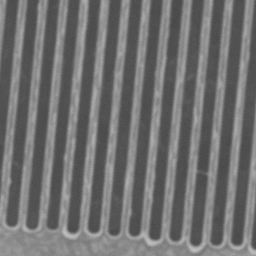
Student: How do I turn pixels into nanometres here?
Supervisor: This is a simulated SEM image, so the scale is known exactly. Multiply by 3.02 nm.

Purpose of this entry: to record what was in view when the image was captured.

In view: parallel lines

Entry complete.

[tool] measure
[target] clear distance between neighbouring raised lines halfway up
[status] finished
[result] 0.0376 micrometres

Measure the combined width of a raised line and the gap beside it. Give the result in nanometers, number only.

62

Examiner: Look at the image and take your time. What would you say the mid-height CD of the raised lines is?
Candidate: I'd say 24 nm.